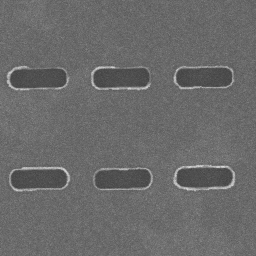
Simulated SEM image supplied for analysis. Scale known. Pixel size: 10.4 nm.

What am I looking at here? holes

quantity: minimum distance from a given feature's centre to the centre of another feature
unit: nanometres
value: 859